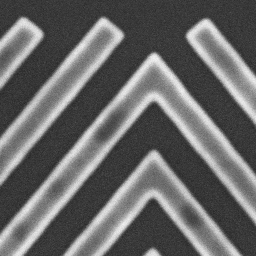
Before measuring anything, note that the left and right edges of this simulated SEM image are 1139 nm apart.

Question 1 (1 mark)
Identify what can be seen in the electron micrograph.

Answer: groups of lines, slits or small figures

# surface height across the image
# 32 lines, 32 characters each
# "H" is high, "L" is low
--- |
LLLLLLLLLLLLLLLLLLLLLLLLLLLLLLLL
LLLLLLLLLLLLLLLLLLLLLLLLLLLLLLLL
LLLLLLLLLLLLLLLLLLLLLLLLLLLLLLLL
LLHHLLLLLLLLHHLLLLLLLLLLLHHLLLLL
LHHHHLLLLLLHHHHLLLLLLLLLHHHLLLLL
HHHHLLLLLLHHHHLLLLLLLLLLHHHHLLLL
HHHHLLLLLHHHHHLLLLLLLLLLLHHHHLLL
HHHLLLLLLHHHHLLLLLLHLLLLLLHHHHLL
HHLLLLLLHHHHLLLLLLHHHLLLLLLHHHHL
HLLLLLLHHHHLLLLLLHHHHHLLLLLHHHHH
LLLLLLHHHHLLLLLLHHHHHHLLLLLLHHHH
LLLLLHHHHLLLLLLHHHHHHHHLLLLLLHHH
LLLLHHHHHLLLLLHHHHHLHHHHLLLLLLHH
LLLLHHHHLLLLLLHHHHLLLHHHHLLLLLLH
LLLHHHHLLLLLLHHHHLLLLHHHHHLLLLLH
LLHHHHLLLLLLHHHHLLLLLLHHHHLLLLLL
LHHHHLLLLLLHHHHLLLLLLLLHHHHLLLLL
HHHHLLLLLLHHHHLLLLLLLLLLHHHHLLLL
HHHHLLLLLHHHHHLLLLLLLLLLLHHHHLLL
HHHLLLLLLHHHHLLLLLLHLLLLLHHHHHLL
HHLLLLLLHHHHLLLLLLHHLLLLLLHHHHLL
HLLLLLLHHHHLLLLLLHHHHLLLLLLHHHHL
LLLLLLHHHHLLLLLLHHHHHHLLLLLLHHHH
LLLLLHHHHHLLLLLHHHHHHHHLLLLLLHHH
LLLLHHHHHLLLLLHHHHHHHHHHLLLLLLHH
LLLLHHHHLLLLLLHHHHLLHHHHHLLLLLHH
LLLHHHHLLLLLLHHHHLLLLHHHHLLLLLLH
LLHHHHLLLLLLHHHHLLLLLLHHHHLLLLLL
LHHHHLLLLLLHHHHLLLLLLLLHHHHLLLLL
HHHHHLLLLLHHHHHLLLLLLLLLHHHHLLLL
HHHHLLLLLHHHHHLLLLLLLLLLHHHHHLLL
HHHLLLLLLHHHHLLLLLLLLLLLLHHHHLLL